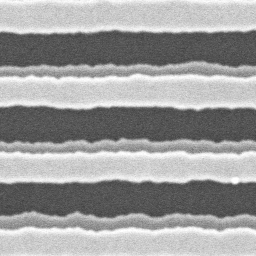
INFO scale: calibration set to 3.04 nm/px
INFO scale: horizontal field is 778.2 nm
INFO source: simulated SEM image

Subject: lines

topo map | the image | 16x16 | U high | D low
UUUUUUUUUUUUUUUU
UUUUUUUUUUUUUUUU
DDDDDDDDDDDDDDDD
DDDDDDDDDDDDDDDD
UUUUUUUUUUUUUUUU
UUUUUUUUUUUUUUUU
UUUUUUUUUUUUUUUU
DDDDDDDDDDDDDDDD
DDDDDDDDDDDDDDDD
UUUUUUUUUUUUUUUU
UUUUUUUUUUUUUUUU
DDDDDDDDDDDDDDDD
DDDDDDDDDDDDDDDD
DUUDUUDDUDUUUDDU
UUUUUUUUUUUUUUUU
UUUUUUUUUUUUUUUU